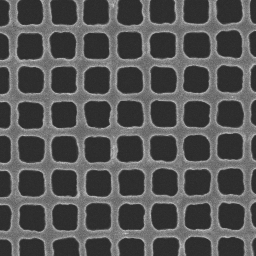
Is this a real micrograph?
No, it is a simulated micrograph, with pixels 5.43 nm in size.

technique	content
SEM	a regular array of holes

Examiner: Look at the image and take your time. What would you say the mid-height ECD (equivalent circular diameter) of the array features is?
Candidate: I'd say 27.7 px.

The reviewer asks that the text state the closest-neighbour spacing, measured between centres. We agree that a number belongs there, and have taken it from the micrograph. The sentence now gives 179 nanometers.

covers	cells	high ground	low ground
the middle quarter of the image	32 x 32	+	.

.+++++++++++++++++++++++++++++++
...+++.....+++.....+++.....+++..
...++......++.......++......++..
...++......++.......++......++..
...++......++.......++......++..
...++......++.......++......++..
...+++.....+++......++......++..
+++++++++.++++++++++++++++++++++
++++++++++++++++++++++++++++++++
..++++.....+++....++++.....++++.
...++......++......+++......++..
...++.......+.......++......++..
...++.......+.......++......++..
...+++.....+++......++......++..
...+++.....+++......++......++..
...+++.....++++....++++.....+++.
++++++++++++++++++++++++++++++++
++++++++++++++++++++++++++++++++
..++++.....+++.....+++......++..
...++.......+......++.......++..
...++.......+.......++......++..
....+.......+.......++......++..
....+.......+.......++......++..
...++.......+.......++......++..
...+++....+++++.++++++++++++++++
++++++++++++++++++++++++++++++++
+++++++.++++++++++.++++....++++.
...+++......++......++......++..
...+++......++......++......++..
...+++......++......++......++..
...++.......++......++......++..
...+++......++......++.......+..